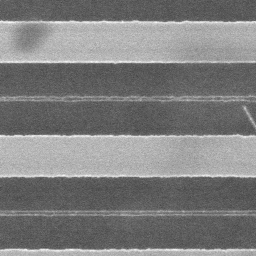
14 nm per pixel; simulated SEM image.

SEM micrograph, lines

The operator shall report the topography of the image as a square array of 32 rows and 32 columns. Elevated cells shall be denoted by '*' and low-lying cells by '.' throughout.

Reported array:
................................
................................
................................
********************************
********************************
********************************
********************************
********************************
................................
................................
................................
................................
...........................**..*
................................
................................
................................
................................
********************************
********************************
********************************
********************************
********************************
................................
................................
................................
................................
................................
................................
................................
................................
................................
********************************